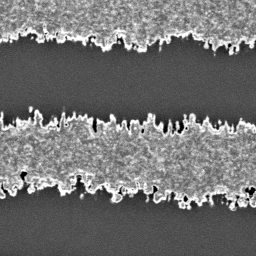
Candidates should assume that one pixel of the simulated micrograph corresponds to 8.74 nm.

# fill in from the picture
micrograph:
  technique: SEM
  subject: one or a few lines or trenches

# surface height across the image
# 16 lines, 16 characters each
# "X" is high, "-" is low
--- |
XXXXXXXXXXXXXXXX
XXXXXXXXXXXXXXXX
------XXXX--XXXX
----------------
----------------
----------------
----------------
----X-----------
XXXXXXXXXXXXXXXX
XXXXXXXXXXXXXXXX
XXXXXXXXXXXXXXXX
XXXXXXXXXXXXXXXX
-----------XX-XX
----------------
----------------
----------------